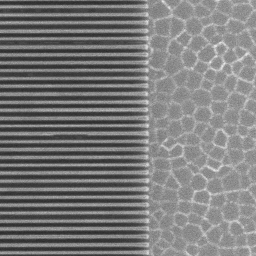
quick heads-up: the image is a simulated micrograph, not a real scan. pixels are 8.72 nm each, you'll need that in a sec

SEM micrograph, parallel lines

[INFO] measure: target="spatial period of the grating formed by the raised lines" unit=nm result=69.2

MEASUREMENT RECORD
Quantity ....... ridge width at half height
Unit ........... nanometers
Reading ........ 31.6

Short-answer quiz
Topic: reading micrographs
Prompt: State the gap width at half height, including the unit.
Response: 4.51 pixels